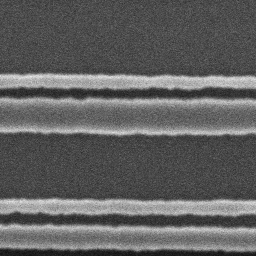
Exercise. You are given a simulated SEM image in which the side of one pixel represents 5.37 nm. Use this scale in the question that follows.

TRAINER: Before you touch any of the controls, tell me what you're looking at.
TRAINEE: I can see lines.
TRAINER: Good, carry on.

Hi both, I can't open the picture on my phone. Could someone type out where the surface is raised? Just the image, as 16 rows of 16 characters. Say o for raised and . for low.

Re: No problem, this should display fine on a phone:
................
................
................
................
................
oooooooooooooooo
oooooooooooooooo
oooooooooooooooo
................
................
................
................
................
oooooooooooooooo
oooooooooooooooo
.ooooooooooooooo